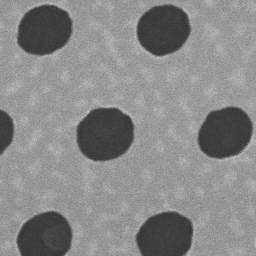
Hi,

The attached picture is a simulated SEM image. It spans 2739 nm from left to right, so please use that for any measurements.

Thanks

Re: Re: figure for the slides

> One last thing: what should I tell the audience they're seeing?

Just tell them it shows holes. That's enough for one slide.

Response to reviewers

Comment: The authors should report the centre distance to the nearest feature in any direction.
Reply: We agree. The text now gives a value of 1270 nm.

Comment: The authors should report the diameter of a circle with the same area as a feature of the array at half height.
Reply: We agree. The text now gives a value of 53.8 pixels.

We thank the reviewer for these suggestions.